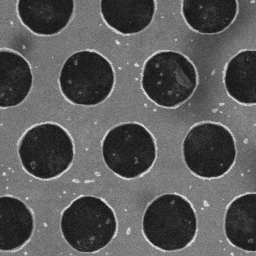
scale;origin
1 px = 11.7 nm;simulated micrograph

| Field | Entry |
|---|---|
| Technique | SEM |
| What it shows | holes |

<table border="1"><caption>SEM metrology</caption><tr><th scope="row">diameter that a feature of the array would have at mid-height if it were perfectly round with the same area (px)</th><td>54.3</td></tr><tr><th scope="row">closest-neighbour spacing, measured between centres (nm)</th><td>952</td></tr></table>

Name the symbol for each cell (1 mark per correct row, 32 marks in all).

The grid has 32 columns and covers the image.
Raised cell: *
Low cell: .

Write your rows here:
**.......****......****.......**
**.......****......****.......**
***......****......****......***
****....******....******....****
********************************
********************************
..********..******************..
...*****.....******....******...
....****......****......****....
....***.......****.......***....
....***.......****.......***....
....****......****......*****...
...******....******....*******..
********************************
********************************
******.*********.********..*****
***.....******....******.....***
***......****......****......***
**.......****......****......***
**.......****......****......***
***......****......****......***
****....******....******....****
********************************
********************************
********************..********..
...******....******.....*****...
....****......****......****....
....****......****.......***....
....****......****.......***....
....****......****......****....
...******....******.....*****...
********************************